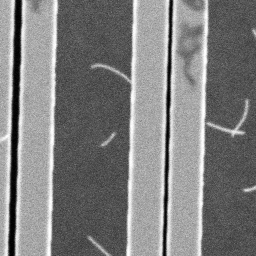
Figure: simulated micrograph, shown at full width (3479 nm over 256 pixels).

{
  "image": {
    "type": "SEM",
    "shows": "lines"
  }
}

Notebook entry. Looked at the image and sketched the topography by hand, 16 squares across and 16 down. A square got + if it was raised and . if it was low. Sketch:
++++....+++++...
+++.....+++++...
+++.....+++++...
+++.....+++++...
+++.....+++++...
+++.....+++++...
+++.....+++++...
+++.....+++++...
+++.....+++++...
+++.....+++++...
+++.....+++++...
+++.....+++++...
+++.....+++++...
+++.....+++++...
+++.....+++++...
+++.....+++++...